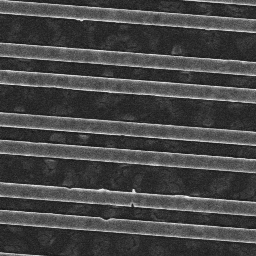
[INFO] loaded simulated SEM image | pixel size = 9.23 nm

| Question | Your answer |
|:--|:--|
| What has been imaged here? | parallel lines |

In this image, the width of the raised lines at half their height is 124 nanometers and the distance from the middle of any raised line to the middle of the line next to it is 0.322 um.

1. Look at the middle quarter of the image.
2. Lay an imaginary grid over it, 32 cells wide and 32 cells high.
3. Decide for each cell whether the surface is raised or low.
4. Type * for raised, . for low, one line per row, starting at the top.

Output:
................****************
.............................***
................................
*********.......................
**********************..........
********************************
......**************************
...................*************
................................
................................
................................
................................
................................
**..............*...............
***************.................
****************************....
********************************
.........***********************
....**.................*********
................................
**..............................
***************.................
****************************....
********************************
.............*******************
..........................******
................................
................................
................................
*...............................
................................
********.**.....................